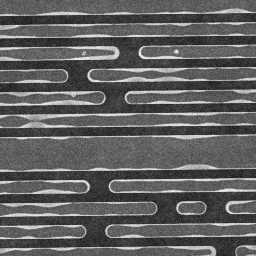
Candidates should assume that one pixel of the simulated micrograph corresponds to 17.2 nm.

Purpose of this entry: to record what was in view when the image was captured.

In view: groups of lines, slits or small figures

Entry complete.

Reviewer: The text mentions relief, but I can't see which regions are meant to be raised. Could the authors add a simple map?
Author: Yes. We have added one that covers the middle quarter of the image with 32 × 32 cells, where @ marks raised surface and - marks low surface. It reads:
--------------------------------
-------@@@@@@--------@------@@@@
@-----@@@@@@@@@@@@@@@@@@@@@@@@@@
@-----@@@@@@@@@@@@@@@@@@@@@@@@@@
--------------------------------
--------------------------------
--------------------------------
@@@@@@@@@@------@@@@@@@@@@@@@@@@
@@@@@@@@@@------@@@@@@@@@@@@@@@@
@@@@@@@@@@------@@@@@@@@@@@@@@@@
--------------------------------
--------------------------------
-----------------@@@@@@@@@@@@@@@
@@@@@@@@@@@@@@@@@@@@@@@@@@@@@@@@
@@@@@@@@@@@@@@@@@@@@@@@@@@@@@@@@
@@@@@@@@@@@@@@@@@@@@@@@---------
--------------------------------
--------------------------------
@@@@@@@@@@@@@@@@@@@@@@@@@@@@@@@@
@@@@@@@@@@@@@@@@@@@@@@@@@@@@@@@@
@@@@@@@@@@@@@@@@@@@@@@@@@@@@@@@@
@@@@@@@@@@@@@@@@@@@@@@@@@@@@@@@@
@@@@@@@@@@@@@@@@@@@@@@@@@@@@@@@@
@@@@@@@@@@@@@@@@@@@@@@@@@@@@@@@@
@@@@@@@@@@@@@@@@@@@@@@@@@@@@@@@@
@@@@@@@@@@@@@@@@@@@@@@@@@@@@@@@@
--------------------------------
--------------------------------
--------------------------------
@@@@@-------@@@@@@@@@@@@@@@@@@@@
@@@@@@-----@@@@@@@@@@@@@@@@@@@@@
@@@@@@------@@@@@@@@@@@@@@@@@@@@